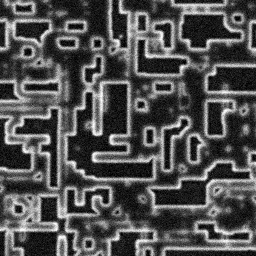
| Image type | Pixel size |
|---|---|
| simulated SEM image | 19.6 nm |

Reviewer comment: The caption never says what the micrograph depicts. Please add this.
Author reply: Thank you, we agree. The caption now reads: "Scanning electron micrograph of wiring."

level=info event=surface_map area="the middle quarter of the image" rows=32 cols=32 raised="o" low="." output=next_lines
oooooooo..oooooooo............oo
ooooo.....oooooooo...........ooo
ooooo....oooooooooooo........ooo
ooooo..ooooooooooooooooooooooooo
ooooo..ooooooooooooooooooooooooo
ooooooooo.......ooooooo....oo.oo
ooooooooo.......ooooooo....oo.oo
ooooo..oo.......oooooooooooooooo
ooooo..oo.......oooooooooooooooo
ooooo..oo.......oo..oooooooooooo
ooooo..oo.......oo..oooooooooooo
ooo....oo.......oooooooooooooooo
ooo....oo.......oooooooooooooooo
ooo....oo.......oooooooooooooooo
ooo....oo.......ooooooooooooo..o
ooo....oo.......ooooooooooooo..o
ooo....oo.......oooo...oo.....oo
ooo.....o.......oooo...oo....ooo
o...........oooooooo...oo..oooo.
o...........oooooooo...oo..oooo.
o...............ooooooooo..oooo.
o...............ooooooooo..oooo.
o......oooooooooooooooooo..oooo.
o......oooooooooooo.ooooo..oooo.
oo.....................oo..ooooo
ooo....................oo..ooooo
ooo....................oo.ooo.oo
ooooo..................ooooooooo
oooooooo..............oooooooooo
ooooooooooooooooooooooooooooo...
ooooooooooooooooooooooooooooo...
o..oo.......ooooooooo...........